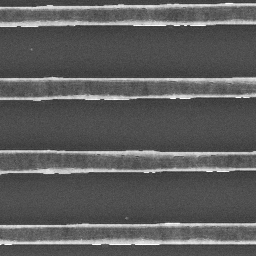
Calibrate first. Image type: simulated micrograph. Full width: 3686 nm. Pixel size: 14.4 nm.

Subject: lines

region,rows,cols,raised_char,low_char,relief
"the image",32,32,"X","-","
--------------------------------
XXXXXXXXXXXXXXXXXXXXXXXXXXXXXXXX
XXXXXXXXXXXXXXXXXXXXXXXXXXXXXXXX
--------------------------------
--------------------------------
--------------------------------
--------------------------------
--------------------------------
--------------------------------
--------------------------------
XXXXXXXXXXXXXXXXXXXXXXXXXXXXXXXX
XXXXXXXXXXXXXXXXXXXXXXXXXXXXXXXX
--------------------------------
--------------------------------
--------------------------------
--------------------------------
--------------------------------
--------------------------------
--------------------------------
XXXXXXXXXXXXXXXXXXXXXXXXXXXXXXXX
XXXXXXXXXXXXXXXXXXXXXXXXXXXXXXXX
XXXXX---------------------------
--------------------------------
--------------------------------
--------------------------------
--------------------------------
--------------------------------
--------------------------------
XXXXXXXXXXXXXXXXXXXXXXXXXXXXXXXX
XXXXXXXXXXXXXXXXXXXXXXXXXXXXXXXX
--------------------------------
--------------------------------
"